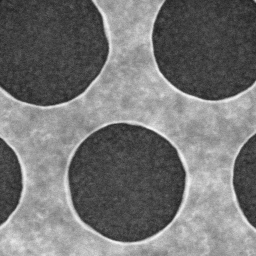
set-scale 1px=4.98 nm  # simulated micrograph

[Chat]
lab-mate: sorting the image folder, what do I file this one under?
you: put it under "holes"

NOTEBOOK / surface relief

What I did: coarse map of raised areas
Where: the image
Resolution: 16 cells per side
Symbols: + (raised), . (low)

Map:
......++++......
......++++......
.......+++......
.......+++......
......++++......
.....++++++.....
++..++++++++++++
++++++++++++++++
++++++....++++++
.++++......++++.
.+++........+++.
.+++........+++.
.+++........+++.
.++++......++++.
++++++....++++++
++++++++++++++++